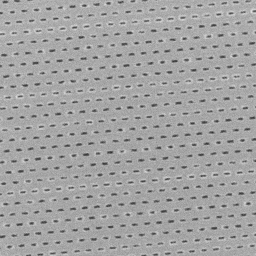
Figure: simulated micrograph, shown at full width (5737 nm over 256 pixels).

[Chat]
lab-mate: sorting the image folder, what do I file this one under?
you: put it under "a regular array of holes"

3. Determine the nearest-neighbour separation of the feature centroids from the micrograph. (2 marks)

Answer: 262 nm